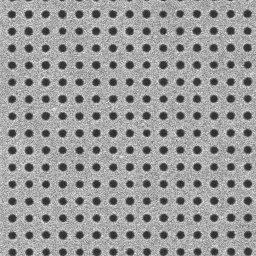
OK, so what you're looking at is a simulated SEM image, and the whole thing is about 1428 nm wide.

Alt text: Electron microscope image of a regular array of holes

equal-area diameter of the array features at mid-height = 46.3 nm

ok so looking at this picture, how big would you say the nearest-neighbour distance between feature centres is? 91.9 nm